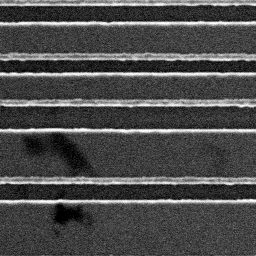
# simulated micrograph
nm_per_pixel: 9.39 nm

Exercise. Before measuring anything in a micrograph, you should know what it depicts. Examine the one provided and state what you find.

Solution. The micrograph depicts lines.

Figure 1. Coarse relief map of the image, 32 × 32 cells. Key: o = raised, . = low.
oooooooooooooooooooooooooooooooo
................................
................................
oooooooooooooooooooooooooooooooo
oooooooooooooooooooooooooooooooo
oooooooooooooooooooooooooooooooo
oooooooooooooooooooooooooooooooo
..o..................o.....oo...
................................
oooooooooooooooooooooooooooooooo
oooooooooooooooooooooooooooooooo
oooooooooooooooooooooooooooooooo
oooooooooooooooooooooooooooooooo
................................
................................
................................
oooooooooooooooooooooooooooooooo
oooooooooooooooooooooooooooooooo
oooooooooooooooooooooooooooooooo
oooooooooooooooooooooooooooooooo
oooooooooooooooooooooooooooooooo
oooooooooooooooooooooooooooooooo
oooooooooooooooooooooooooooooooo
................................
................................
oooooooooooooooooooooooooooooooo
oooooooooooooooooooooooooooooooo
oooooooooooooooooooooooooooooooo
oooooooooooooooooooooooooooooooo
oooooooooooooooooooooooooooooooo
oooooooooooooooooooooooooooooooo
oooooooooooooooooooooooooooooooo